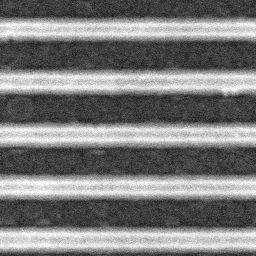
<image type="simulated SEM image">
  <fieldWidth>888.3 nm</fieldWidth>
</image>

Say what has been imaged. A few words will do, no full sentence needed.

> parallel lines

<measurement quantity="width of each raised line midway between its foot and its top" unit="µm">0.0621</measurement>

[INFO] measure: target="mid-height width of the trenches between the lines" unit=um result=0.121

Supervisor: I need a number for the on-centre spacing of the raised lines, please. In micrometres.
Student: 0.183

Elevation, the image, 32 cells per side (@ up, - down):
--------------------------------
--------------------------------
--------------------------------
@@@@@@@@@@@@@@@@@@@@@@@@@@@@@@@@
@@@@@@@@@@@@@@@@@@@@@@@@@@@@@@@@
--------------------------------
--------------------------------
--------------------------------
--------------------------------
@@@@@@@@@@@@@@@@@@@@@@@@@@@@@@@@
@@@@@@@@@@@@@@@@@@@@@@@@@@@@@@@@
----------------------------@@--
--------------------------------
--------------------------------
--------------------------------
--------------------------------
@@@@@@@@@@@@@@@@@@@@@@@@@@@@@@@@
@@@@@@@@@@@@@@@@@@@@@@@@@@@@@@@@
--------------------------------
--------------------------------
--------------------------------
--------------------------------
@@@@@@@@@@@@@@@@@@@@@@@@@@@@@@@@
@@@@@@@@@@@@@@@@@@@@@@@@@@@@@@@@
--------------------------------
--------------------------------
--------------------------------
--------------------------------
--------------------------------
@@@@@@@@@@@@@@@@@@@@@@@@@@@@@@@@
@@@@@@@@@@@@@@@@@@@@@@@@@@@@@@@@
--------------------------------